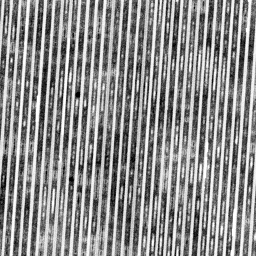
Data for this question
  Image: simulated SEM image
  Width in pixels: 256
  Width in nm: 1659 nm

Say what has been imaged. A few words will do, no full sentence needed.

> parallel lines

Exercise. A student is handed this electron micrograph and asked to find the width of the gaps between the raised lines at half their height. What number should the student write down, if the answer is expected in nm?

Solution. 39.6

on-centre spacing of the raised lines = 55 nm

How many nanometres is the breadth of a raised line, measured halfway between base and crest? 17